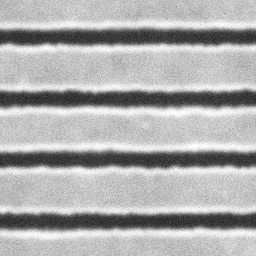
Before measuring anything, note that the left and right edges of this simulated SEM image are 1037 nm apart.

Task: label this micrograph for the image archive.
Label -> lines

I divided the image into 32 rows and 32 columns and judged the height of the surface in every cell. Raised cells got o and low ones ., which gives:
oooooooooooooooooooooooooooooooo
oooooooooooooooooooooooooooooooo
oooooooooooooooooooooooooooooooo
oooooooo..ooo..........ooo...oo.
................................
................................
oooooooooooooooooooooooooooooooo
oooooooooooooooooooooooooooooooo
oooooooooooooooooooooooooooooooo
oooooooooooooooooooooooooooooooo
oooooooooooooooooooooooooooooooo
................................
................................
.ooooooo.oooooo.ooo..o.oo...o.oo
oooooooooooooooooooooooooooooooo
oooooooooooooooooooooooooooooooo
oooooooooooooooooooooooooooooooo
oooooooooooooooooooooooooooooooo
oooooooooooooooooooooooooooooooo
................................
................................
oooooooooooooooooooooooooooooooo
oooooooooooooooooooooooooooooooo
oooooooooooooooooooooooooooooooo
oooooooooooooooooooooooooooooooo
oooooooooooooooooooooooooooooooo
ooooo.oooooooooooooooooooo...ooo
................................
................................
oooooooooooooooooooooooooooooooo
oooooooooooooooooooooooooooooooo
oooooooooooooooooooooooooooooooo